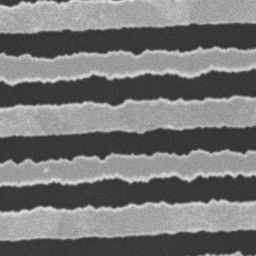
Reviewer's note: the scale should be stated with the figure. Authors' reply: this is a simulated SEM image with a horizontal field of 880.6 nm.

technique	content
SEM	lines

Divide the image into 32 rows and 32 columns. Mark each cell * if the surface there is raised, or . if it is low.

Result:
..******************************
********************************
********************************
***************.................
................................
................................
..............**..****.*********
********************************
********************************
***********..****.....***.......
.*..............................
................................
................*..**.*..*******
.*******************************
********************************
********************************
***********......*..............
................................
................................
..............****.*************
********************************
********************************
*************..****....*........
................................
................................
..................***..*********
********************************
********************************
********************************
****************................
................................
................................